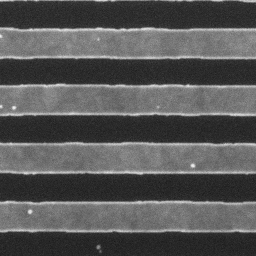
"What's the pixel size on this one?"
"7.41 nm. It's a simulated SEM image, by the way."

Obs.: lines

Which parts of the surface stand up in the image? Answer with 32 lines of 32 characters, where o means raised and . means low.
................................
................................
................................
................................
oooooooooooooooooooooooooooooooo
oooooooooooooooooooooooooooooooo
oooooooooooooooooooooooooooooooo
................................
................................
................................
................................
oooooooooooooooooooooooooooooooo
oooooooooooooooooooooooooooooooo
oooooooooooooooooooooooooooooooo
................................
................................
................................
................................
oooooooooooooooooooooooooooooooo
oooooooooooooooooooooooooooooooo
oooooooooooooooooooooooooooooooo
oooooooooooooooooooooooooooooooo
................................
................................
................................
oooooooooooooooooooooooooooooooo
oooooooooooooooooooooooooooooooo
oooooooooooooooooooooooooooooooo
oooooooooooooooooooooooooooooooo
................................
................................
................................